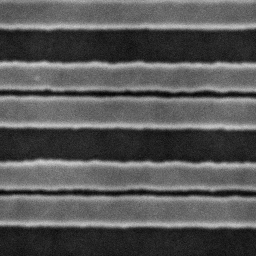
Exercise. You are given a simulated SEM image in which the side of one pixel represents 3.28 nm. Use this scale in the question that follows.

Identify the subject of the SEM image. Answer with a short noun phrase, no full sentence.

lines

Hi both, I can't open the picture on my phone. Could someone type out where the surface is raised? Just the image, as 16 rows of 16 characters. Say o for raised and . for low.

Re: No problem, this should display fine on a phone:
oooooooooooooooo
oooooooooooooooo
................
................
oooooooooooooooo
oooooooooooooooo
oooooooooooooooo
oooooooooooooooo
................
................
oooooooooooooooo
oooooooooooooooo
oooooooooooooooo
oooooooooooooooo
................
................